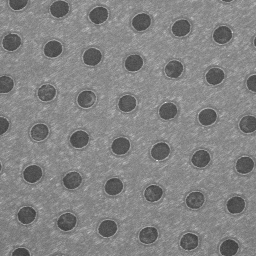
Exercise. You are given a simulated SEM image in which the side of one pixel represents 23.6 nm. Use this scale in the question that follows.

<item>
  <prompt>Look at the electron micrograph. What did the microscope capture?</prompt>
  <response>a regular array of raised bodies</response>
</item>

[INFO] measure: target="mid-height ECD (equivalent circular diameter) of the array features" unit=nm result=446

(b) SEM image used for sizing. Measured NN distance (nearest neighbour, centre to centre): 958 nanometers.